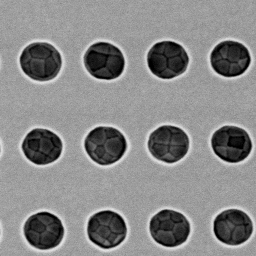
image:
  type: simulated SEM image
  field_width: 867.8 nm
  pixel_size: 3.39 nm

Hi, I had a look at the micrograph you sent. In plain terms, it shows a regular array of holes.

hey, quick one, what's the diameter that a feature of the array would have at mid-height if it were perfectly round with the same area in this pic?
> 0.132 microns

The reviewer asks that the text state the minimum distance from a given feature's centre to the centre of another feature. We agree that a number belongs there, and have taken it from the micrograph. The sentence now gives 0.213 um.